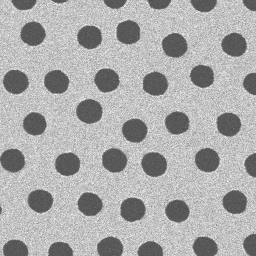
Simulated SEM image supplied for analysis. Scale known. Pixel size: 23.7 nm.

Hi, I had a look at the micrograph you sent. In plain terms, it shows a regular array of holes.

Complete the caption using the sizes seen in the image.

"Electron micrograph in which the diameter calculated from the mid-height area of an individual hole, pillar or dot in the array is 589 nanometres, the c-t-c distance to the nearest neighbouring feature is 989 nanometres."